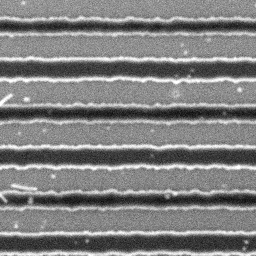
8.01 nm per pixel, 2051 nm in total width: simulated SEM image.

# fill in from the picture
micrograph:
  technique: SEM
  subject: lines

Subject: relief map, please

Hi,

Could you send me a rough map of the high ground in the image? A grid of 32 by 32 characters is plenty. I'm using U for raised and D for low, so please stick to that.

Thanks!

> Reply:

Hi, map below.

DDDDDDDDDDDDDDDDDDDDDDDDDDDDDDDD
DDDDDDDDDDDDDDDDDDDDDDDDDDDDDDDD
UUUUUUUUUUUUUUUUUUUUUUUUUUUUUUUU
UUUUUUUUUUUUUUUUUUUUUUUUUUUUUUUU
DDDDDDDDDDDDDDDDDDDDDDDDDDDDDDDD
DDDDDDDDDDDDDDDDDDDDDDDDDDDDDDDD
DDDDDDDDDDDDDDDDDDDDDDDDDDDDDDDD
UUUUUUUUUUUUUUUUUUUUUUUUUUUUUUUU
UUUUUUUUUUUUUUUUUUUUUUUUUUUUUUUU
UUUUUUUUUUUUUUUUUUUUUUUUUUUUUUUU
DDDDDDDDDDDDDDDDDDDDDDDDDDDDDDDD
DDDDDDDDDDDDDDDDDDDDDDDDDDDDDDDD
DDDDDDDDDDDDDDDDDDDDDDDDDDDDDDDD
UUUUUUUUUUUUUUUUUUUUUUUUUUUUUUUU
UUUUUUUUUUUUUUUUUUUUUUUUUUUUUUUU
DDDDDDDDDDDDDDDDDDDDDDDDDDDDDDDD
DDDDDDDDDDDDDDDDDDDDDDDDDDDDDDDD
DDDDDDDDDDDDDDDDDDDDDDDDDDDDDDDD
UUUUUUUUUUUUUUUUUUUUUUUUUUUUUUUU
UUUUUUUUUUUUUUUUUUUUUUUUUUUUUUUU
UUUUUUUUUUUUUUUUUUUUUUUUUUUUUUUU
DDDDDDDDDDDDDDDDDDDDDDDDDDDDDDDD
DDDDDDDDDDDDDDDDDDDDDDDDDDDDDDDD
DDDDDDDDDDDDDDDDDDDDDDDDDDDDDDDD
UUUUUUUUUUUUUUUUUUUUUUUUUUUUUUUU
UUUUUUUUUUUUUUUUUUUUUUUUUUUUUUUU
DDDDDDDDDDDDDDDDDDDDDDDDDDDDDDDD
DDDDDDDDDDDDDDDDDDDDDDDDDDDDDDDD
DDDDDDDDDDDDDDDDDDDDDDDDDDDDDDDD
UUUUUUUUUUUUUUUUUUUUUUUUUUUUUUUU
UUUUUUUUUUUUUUUUUUUUUUUUUUUUUUUU
UUUUUUUUUUUUUUUUUUUUUUUUUUUUUUUU